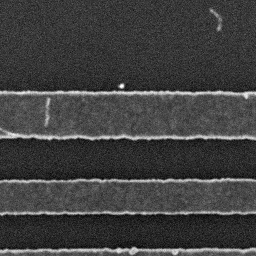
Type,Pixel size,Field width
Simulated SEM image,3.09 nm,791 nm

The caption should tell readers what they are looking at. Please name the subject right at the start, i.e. lines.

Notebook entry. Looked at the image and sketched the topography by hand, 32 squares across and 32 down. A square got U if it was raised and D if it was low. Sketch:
DDDDDDDDDDDDDDDDDDDDDDDDDDDDDDDD
DDDDDDDDDDDDDDDDDDDDDDDDDDDDDDDD
DDDDDDDDDDDDDDDDDDDDDDDDDDDDDDDD
DDDDDDDDDDDDDDDDDDDDDDDDDDDDDDDD
DDDDDDDDDDDDDDDDDDDDDDDDDDDDDDDD
DDDDDDDDDDDDDDDDDDDDDDDDDDDDDDDD
DDDDDDDDDDDDDDDDDDDDDDDDDDDDDDDD
DDDDDDDDDDDDDDDDDDDDDDDDDDDDDDDD
DDDDDDDDDDDDDDDDDDDDDDDDDDDDDDDD
DDDDDDDDDDDDDDDDDDDDDDDDDDDDDDDD
DDDDDDDDDDDDDDDDDDDDDDDDDDDDDDDD
DDDUDDDUDDDDDDDDDDDDDDDDDDDUDDDD
UUUUUUUUUUUUUUUUUUUUUUUUUUUUUUUU
UUUUUUUUUUUUUUUUUUUUUUUUUUUUUUUU
UUUUUUUUUUUUUUUUUUUUUUUUUUUUUUUU
UUUUUUUUUUUUUUUUUUUUUUUUUUUUUUUU
UUUUUUUUUUUUUUUUUUUUUUUUUUUUUUUU
DDDDDDDDDDDDDDDDDDDDDDDDDDDDDDDD
DDDDDDDDDDDDDDDDDDDDDDDDDDDDDDDD
DDDDDDDDDDDDDDDDDDDDDDDDDDDDDDDD
DDDDDDDDDDDDDDDDDDDDDDDDDDDDDDDD
DDDDDDDDDDDDDDDDDDDDDDDDDDDDDDDD
DDDDDDDDDUUUUUUDDDDDDUUUUDUUUUUU
UUUUUUUUUUUUUUUUUUUUUUUUUUUUUUUU
UUUUUUUUUUUUUUUUUUUUUUUUUUUUUUUU
UUUUUUUUUUUUUUUUUUUUUUUUUUUUUUUU
UUUUUUUUUUUUUUUUUUUUUUUUUUUUUUUU
DDDDDDDDDDDDDDDDDDDDDDDDDDDDDDDD
DDDDDDDDDDDDDDDDDDDDDDDDDDDDDDDD
DDDDDDDDDDDDDDDDDDDDDDDDDDDDDDDD
DDDDDDDDDDDDDDDDDDDDDDDDDDDDDDDD
UUUUUUUUUUUUUUUUUUUUUUUUUUUUUUUU